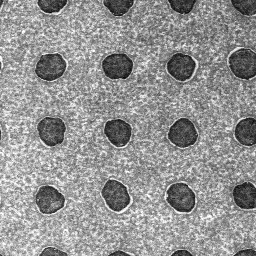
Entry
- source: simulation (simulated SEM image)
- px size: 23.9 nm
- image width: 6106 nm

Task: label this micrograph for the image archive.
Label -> a regular array of holes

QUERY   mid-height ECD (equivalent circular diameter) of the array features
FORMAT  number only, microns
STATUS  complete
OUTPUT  0.701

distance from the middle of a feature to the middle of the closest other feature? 1.54 um